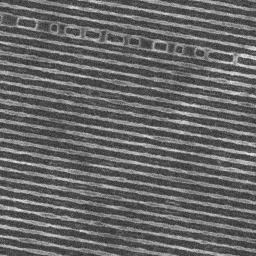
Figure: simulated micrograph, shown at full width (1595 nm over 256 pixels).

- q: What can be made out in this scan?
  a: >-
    parallel lines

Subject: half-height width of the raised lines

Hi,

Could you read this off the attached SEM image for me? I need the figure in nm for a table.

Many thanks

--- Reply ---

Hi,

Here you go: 19.2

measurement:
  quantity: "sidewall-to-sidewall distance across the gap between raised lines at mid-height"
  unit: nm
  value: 40.7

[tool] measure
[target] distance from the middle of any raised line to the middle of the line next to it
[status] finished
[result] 59.2 nm